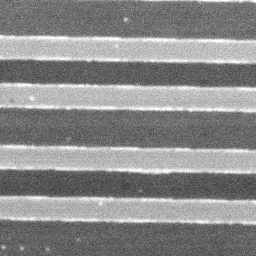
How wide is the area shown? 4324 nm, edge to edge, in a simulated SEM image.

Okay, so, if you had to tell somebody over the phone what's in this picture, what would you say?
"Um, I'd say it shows lines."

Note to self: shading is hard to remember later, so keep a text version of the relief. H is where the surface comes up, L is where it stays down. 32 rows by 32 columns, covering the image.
LLLLLLLLLLLLLLLLLLLLLLLLLLLLLLLL
LLLLLLLLLLLLLLLLLLLLLLLLLLLLLLLL
LLLLLLLLLLLLLLLLLLLLLLLLLLLLLLLL
LLLLLLLLLLLLLLLLLLLLLLLLLLLLLLLL
LLLLLLLLLLLLLLLLLLLLLLLLLLLLLLLL
HHHHHHHHHHHHHHHHHHHHHHHHHHHHHHHH
HHHHHHHHHHHHHHHHHHHHHHHHHHHHHHHH
LLLLLLLLLLLHHHHHHHHHHHHHHHHHHHHH
LLLLLLLLLLLLLLLLLLLLLLLLLLLLLLLL
LLLLLLLLLLLLLLLLLLLLLLLLLLLLLLLL
LLLLLLLLLLLLLLLLLLLLLLLLLLLLLLLL
HHHHHHHHHHHHHHHHHHHHHHHHHHHHHHHH
HHHHHHHHHHHHHHHHHHHHHHHHHHHHHHHH
LLLLLLLLHLLHHHHHHHHHHHHHHHHHHHHH
LLLLLLLLLLLLLLLLLLLLLLLLLLLLLLLL
LLLLLLLLLLLLLLLLLLLLLLLLLLLLLLLL
LLLLLLLLLLLLLLLLLLLLLLLLLLLLLLLL
LLLLLLLLLLLLLLLLLLLLLLLLLLLLLLLL
HHHHHHHHHHLLLLLLLLLLLLLLLLLLLLLL
HHHHHHHHHHHHHHHHHHHHHHHHHHHHHHHH
HHHHHHHHHHHHHHHHHHHHHHHHHHHHHHHH
LLLLLLLLLLLLLLLLLLLLLLLLLLLHHHHH
LLLLLLLLLLLLLLLLLLLLLLLLLLLLLLLL
LLLLLLLLLLLLLLLLLLLLLLLLLLLLLLLL
LLLLLLLLLLLLLLLLLLLLLLLLLLLLLLLL
HHHHHHHHHHHHHHHHHHHHHHHHHHHHHHHH
HHHHHHHHHHHHHHHHHHHHHHHHHHHHHHHH
LLLLLLLHHHHHHHHHHHHHHHHHHHHHHHHH
LLLLLLLLLLLLLLLLLLLLLLLLLLLLLLLL
LLLLLLLLLLLLLLLLLLLLLLLLLLLLLLLL
LLLLLLLLLLLLLLLLLLLLLLLLLLLLLLLL
LLLLLLLLLLLLLLLLLLLLLLLLLLLLLLLL